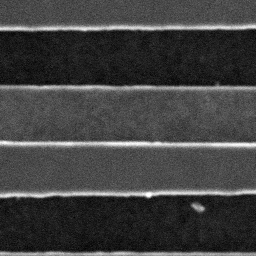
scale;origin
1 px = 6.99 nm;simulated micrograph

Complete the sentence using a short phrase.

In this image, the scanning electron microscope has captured lines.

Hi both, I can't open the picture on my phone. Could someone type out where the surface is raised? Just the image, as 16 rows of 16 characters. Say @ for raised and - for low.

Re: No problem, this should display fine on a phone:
@@@@@@@@@@@@@@@@
@@@@@@@@@@@@@@@@
----------------
----------------
----------------
@@@@@@@@@@@@@@@@
@@@@@@@@@@@@@@@@
@@@@@@@@@@@@@@@@
@@@@@@@@@@@@@@@@
@@@@@@@@@@@@@@@@
@@@@@@@@@@@@@@@@
@@@@@@@@@@@@@@@@
----------------
----------------
----------------
----------------